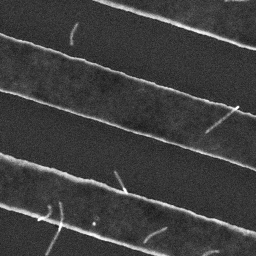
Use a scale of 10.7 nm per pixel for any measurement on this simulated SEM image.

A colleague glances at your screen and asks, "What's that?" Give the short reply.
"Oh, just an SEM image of lines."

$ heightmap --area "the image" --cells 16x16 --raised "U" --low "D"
DDDDDDDDUUUUUUUU
DDDDDDDDDDDUUUUU
UDDDDDDDDDDDDDUU
UUUUDDDDDDDDDDDD
UUUUUUUDDDDDDDDD
UUUUUUUUUUDDDDDD
DDDUUUUUUUUUUUDD
DDDDDDUUUUUUUUUU
DDDDDDDDDUUUUUUU
DDDDDDDDDDDDUUUU
UUUDDDDDDDDDDDDU
UUUUUUDDDDDDDDDD
UUUUUUUUUUDDDDDD
DDUUUUUUUUUUUDDD
DDDDDUUUUUUUUUUU
DDDDDDDDUUUUUUUU